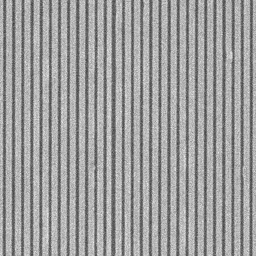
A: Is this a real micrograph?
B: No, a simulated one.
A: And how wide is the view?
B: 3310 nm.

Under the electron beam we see parallel lines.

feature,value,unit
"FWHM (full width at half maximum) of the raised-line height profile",5.63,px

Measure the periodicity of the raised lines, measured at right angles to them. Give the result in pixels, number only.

9.15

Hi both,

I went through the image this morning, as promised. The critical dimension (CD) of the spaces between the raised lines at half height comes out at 46.9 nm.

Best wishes